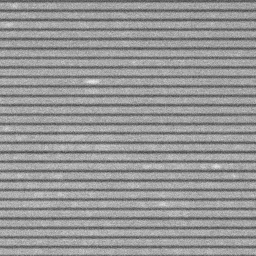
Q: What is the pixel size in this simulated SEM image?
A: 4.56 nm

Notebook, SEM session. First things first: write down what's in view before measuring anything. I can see parallel lines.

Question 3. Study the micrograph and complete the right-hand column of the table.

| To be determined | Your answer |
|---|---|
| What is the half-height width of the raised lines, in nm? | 27.4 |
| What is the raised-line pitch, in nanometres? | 43.2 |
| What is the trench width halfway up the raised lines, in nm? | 15.4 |